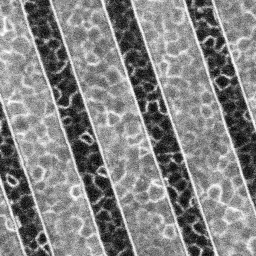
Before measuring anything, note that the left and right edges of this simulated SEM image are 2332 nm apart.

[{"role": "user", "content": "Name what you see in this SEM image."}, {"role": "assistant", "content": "one or a few lines or trenches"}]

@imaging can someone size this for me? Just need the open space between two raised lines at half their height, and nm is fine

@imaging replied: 443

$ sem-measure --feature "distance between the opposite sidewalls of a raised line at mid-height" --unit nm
261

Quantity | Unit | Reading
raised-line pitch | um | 0.703